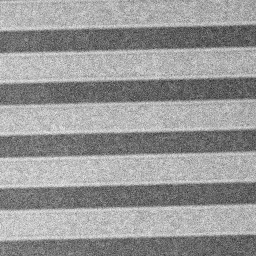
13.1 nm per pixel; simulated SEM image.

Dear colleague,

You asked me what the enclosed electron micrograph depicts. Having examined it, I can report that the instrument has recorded parallel lines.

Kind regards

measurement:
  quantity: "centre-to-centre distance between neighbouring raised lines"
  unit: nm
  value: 685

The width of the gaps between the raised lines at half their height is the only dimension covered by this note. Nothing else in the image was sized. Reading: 333 nanometers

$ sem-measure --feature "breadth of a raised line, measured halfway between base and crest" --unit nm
356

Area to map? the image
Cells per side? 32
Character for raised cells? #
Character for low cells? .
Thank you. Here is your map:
################################
################################
################################
######..........................
................................
................................
..................##############
################################
################################
##########################......
................................
................................
................................
################################
################################
################################
##########......................
................................
................................
......................##########
################################
################################
##############################..
................................
................................
................................
..##############################
################################
################################
##############..................
................................
................................